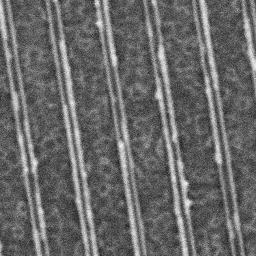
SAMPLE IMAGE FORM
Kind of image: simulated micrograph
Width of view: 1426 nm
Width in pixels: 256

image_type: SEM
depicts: parallel lines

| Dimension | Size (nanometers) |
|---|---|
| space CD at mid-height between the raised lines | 208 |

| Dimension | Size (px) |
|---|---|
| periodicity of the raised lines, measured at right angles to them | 48.2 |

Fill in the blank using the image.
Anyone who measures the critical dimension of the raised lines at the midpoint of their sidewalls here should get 11.2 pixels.